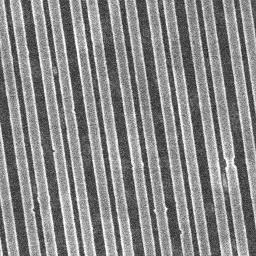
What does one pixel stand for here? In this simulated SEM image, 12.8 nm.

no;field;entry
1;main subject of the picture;parallel lines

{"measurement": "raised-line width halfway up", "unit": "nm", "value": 134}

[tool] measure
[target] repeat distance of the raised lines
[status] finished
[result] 242 nanometres